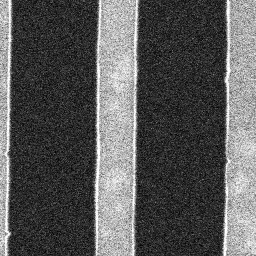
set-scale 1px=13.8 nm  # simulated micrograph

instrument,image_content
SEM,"one or a few lines or trenches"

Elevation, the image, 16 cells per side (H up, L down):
LHHHHHLLLHHHHHLL
LHHHHHLLLHHHHHLL
LHHHHHLLHHHHHHLL
LHHHHHLLHHHHHHLL
LHHHHHLLHHHHHHLL
LHHHHHLLHHHHHHLL
LHHHHHLLHHHHHHLL
LHHHHHLLHHHHHHLL
HHHHHHLLHHHHHHLL
HHHHHHLLHHHHHHLL
HHHHHHLLHHHHHHLL
HHHHHHLLHHHHHHLL
HHHHHHLLHHHHHHLL
HHHHHHLLHHHHHHLL
HHHHHHLLHHHHHHLL
HHHHHHLLHHHHHHLL